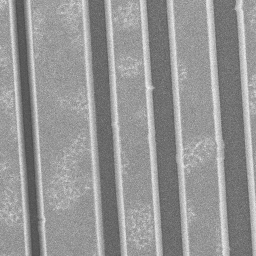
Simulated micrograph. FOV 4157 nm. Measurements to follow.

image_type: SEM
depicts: one or a few lines or trenches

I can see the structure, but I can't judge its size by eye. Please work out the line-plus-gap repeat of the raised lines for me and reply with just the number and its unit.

1.09 micrometres